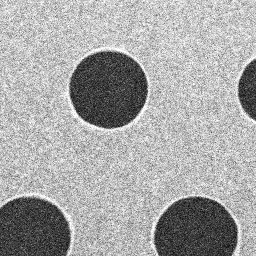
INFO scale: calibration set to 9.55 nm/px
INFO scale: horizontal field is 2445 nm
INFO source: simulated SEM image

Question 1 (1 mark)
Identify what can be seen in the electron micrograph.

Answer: holes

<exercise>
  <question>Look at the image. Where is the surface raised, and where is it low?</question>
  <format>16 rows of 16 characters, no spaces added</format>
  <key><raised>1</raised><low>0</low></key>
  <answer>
1111111111111111
1111111111111111
1111111111111111
1111100011111111
1111100001111110
1111000001111110
1111100001111110
1111100011111111
1111111111111111
1111111111111111
1111111111111111
1111111111111111
1001111111100111
0000111111000011
0000111111000001
0000111111000001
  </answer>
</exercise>